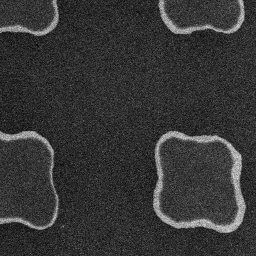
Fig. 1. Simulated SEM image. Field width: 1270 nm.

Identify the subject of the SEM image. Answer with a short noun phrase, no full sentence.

raised bodies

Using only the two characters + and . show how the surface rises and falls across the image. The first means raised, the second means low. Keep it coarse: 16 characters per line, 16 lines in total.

++++......+++++.
+++........++++.
................
................
................
................
................
................
.+........++....
+++.......+++++.
+++.......+++++.
+++.......+++++.
++++......+++++.
++++......+++++.
................
................